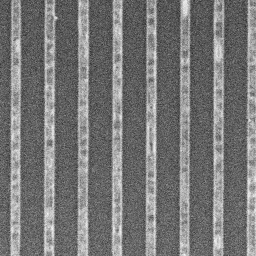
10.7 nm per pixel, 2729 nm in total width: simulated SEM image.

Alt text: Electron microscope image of parallel lines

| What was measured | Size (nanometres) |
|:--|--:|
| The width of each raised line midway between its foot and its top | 90.6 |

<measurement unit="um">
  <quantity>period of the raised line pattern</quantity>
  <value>0.36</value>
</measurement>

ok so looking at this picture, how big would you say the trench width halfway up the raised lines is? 0.271 micrometres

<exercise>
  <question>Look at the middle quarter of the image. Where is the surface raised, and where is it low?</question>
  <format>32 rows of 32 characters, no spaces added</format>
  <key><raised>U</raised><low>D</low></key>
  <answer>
DDDDUUDDDDDDUUDDDDDDDUUDDDDDDUUD
DDDDUUDDDDDDUUDDDDDDDUUDDDDDDUUD
DDDDUUDDDDDDUUDDDDDDDUUDDDDDDUUD
DDDDUUDDDDDDUUDDDDDDDUUDDDDDDUUD
DDDDUUDDDDDDUUDDDDDDDUUDDDDDDUUD
DDDDUUDDDDDDUUDDDDDDDUUDDDDDDUUD
DDDDUUDDDDDDUUDDDDDDDUUDDDDDDUUD
DDDDUUDDDDDDUUDDDDDDDUUDDDDDDUUD
DDDDUUDDDDDDUUDDDDDDDUUDDDDDDUUD
DDDDUUDDDDDDUUDDDDDDDUUDDDDDDUUD
DDDDUUDDDDDDUUDDDDDDDDUDDDDDDUUD
DDDDUUDDDDDDUUDDDDDDDUUDDDDDDUUD
DDDDUUDDDDDDUUDDDDDDDUUDDDDDDUUD
DDDDUUDDDDDDUDDDDDDDDUUDDDDDDUUD
DDDDUUDDDDDDUUDDDDDDDUUDDDDDDUUD
DDDDUUDDDDDDUUDDDDDDDUUDDDDDDUUD
DDDDUUDDDDDDUUDDDDDDDDUDDDDDDUUD
DDDDUUDDDDDDUUDDDDDDDUUDDDDDDUUD
DDDDUUDDDDDDUUDDDDDDDUUDDDDDDUUD
DDDDUUDDDDDDUUDDDDDDDDUDDDDDDUUD
DDDDUUDDDDDDUUDDDDDDDDUDDDDDDUUD
DDDDUUDDDDDDUUDDDDDDDDUDDDDDDUUD
DDDDUUDDDDDDUUDDDDDDDUUDDDDDDUUD
DDDDUUDDDDDDUUDDDDDDDUUDDDDDDUUD
DDDDUUDDDDDDUUDDDDDDDUUDDDDDDUUD
DDDDUUDDDDDDUUDDDDDDDUUDDDDDDUUD
DDDDUUDDDDDDUUDDDDDDDUUDDDDDDUUD
DDDDUUDDDDDDUUDDDDDDDUUDDDDDDUUD
DDDDUUDDDDDDUUDDDDDDDUUDDDDDDUUD
DDDDUUDDDDDDUUDDDDDDDUUDDDDDDUUD
DDDDUUDDDDDDUUDDDDDDDUUDDDDDDUUD
DDDDUUDDDDDDUUDDDDDDDUUDDDDDDUUD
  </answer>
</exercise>